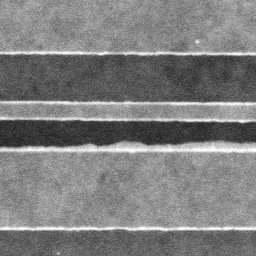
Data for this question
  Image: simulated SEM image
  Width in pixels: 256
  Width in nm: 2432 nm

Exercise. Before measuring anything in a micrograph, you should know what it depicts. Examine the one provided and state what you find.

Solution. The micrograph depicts lines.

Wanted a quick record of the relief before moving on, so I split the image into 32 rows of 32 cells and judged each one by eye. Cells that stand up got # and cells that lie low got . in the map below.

################################
################################
################################
################################
################################
################################
################################
................................
................................
................................
................................
................................
................................
################################
################################
................................
................................
................................
...............#.........###....
################################
################################
################################
################################
################################
################################
################################
################################
################################
################################
................................
................................
................................